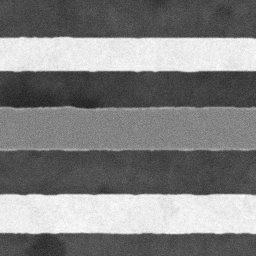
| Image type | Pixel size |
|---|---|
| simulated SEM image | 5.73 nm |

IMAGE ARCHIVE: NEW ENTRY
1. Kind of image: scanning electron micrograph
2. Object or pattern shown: lines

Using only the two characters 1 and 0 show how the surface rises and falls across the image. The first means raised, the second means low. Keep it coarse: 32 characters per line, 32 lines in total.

00000000000000000000000000000000
00000000000000000000000000000000
00000000000000000000000000000000
00000000000000000000000000000000
00000000000000000000000000000000
11111111111111111111111111111111
11111111111111111111111111111111
11111111111111111111111111111111
11111111111111111111111111111111
00000000000000000000000000000000
00000000000000000000000000000000
00000000000000000000000000000000
00000000000000000000000000000000
11001111110000100011111111111101
11111111111111111111111111111111
11111111111111111111111111111111
11111111111111111111111111111111
11111111111111111111111111111111
11111111111111111111111111111111
00000000000000000000000000000000
00000000000000000000000000000000
00000000000000000000000000000000
00000000000000000000000000000000
00000000000000000000000000000000
11111111111111111111111111111111
11111111111111111111111111111111
11111111111111111111111111111111
11111111111111111111111111111111
11111111111111111111111111111111
00000000000000000000000000000000
00000000000000000000000000000000
00000000000000000000000000000000